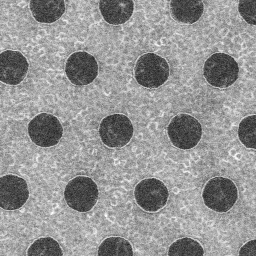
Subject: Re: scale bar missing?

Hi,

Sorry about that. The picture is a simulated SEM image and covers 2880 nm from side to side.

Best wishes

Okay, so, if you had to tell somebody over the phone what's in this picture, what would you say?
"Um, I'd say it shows a regular array of raised bodies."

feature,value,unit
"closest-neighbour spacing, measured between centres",69.3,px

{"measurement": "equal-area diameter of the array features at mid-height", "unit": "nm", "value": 408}